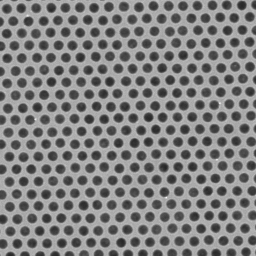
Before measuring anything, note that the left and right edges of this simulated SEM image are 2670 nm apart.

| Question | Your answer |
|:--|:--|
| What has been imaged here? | a regular array of holes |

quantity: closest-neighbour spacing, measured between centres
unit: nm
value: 144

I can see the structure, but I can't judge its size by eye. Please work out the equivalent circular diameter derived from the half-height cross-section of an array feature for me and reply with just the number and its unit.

98.4 nanometres